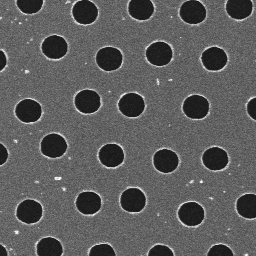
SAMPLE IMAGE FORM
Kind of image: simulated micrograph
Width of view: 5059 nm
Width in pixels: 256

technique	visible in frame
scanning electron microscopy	a regular array of holes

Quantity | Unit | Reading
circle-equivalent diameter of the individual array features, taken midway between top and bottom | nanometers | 497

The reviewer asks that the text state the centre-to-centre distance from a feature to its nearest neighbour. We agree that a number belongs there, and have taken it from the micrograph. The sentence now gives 985 nanometres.